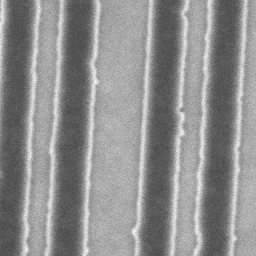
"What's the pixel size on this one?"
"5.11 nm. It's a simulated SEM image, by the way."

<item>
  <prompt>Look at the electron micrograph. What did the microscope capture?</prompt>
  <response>one or a few lines or trenches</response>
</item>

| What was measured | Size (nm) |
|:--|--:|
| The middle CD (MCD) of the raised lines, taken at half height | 196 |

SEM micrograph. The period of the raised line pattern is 374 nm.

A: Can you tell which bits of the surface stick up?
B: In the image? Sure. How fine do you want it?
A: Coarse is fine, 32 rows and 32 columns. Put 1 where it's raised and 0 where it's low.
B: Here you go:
11111000111100000001111000111110
11111000111100000001111000111110
11111001111100000001111000111110
11111001111100000001111000111110
11111001111100000001111000111110
11111001111100000011111000111110
11111001111100000011111000111100
11110001111100000011111000111100
11110001111100000011111000111100
11110001111100000011111000111100
11110001111100000011111000111100
11110001111100000011111001111100
11110001111100000011111001111100
11110001111100000011111001111100
11110001111100000011111001111100
11110001111100000011111001111100
11110001111100000011111001111100
11110001111000000011110001111100
11110011111000000011110001111100
11110011111000000011110001111100
11110011111000000011110001111100
11110011111000000011110001111100
11110011111000000111110001111100
11110011111000000111110001111000
11100011111000000111110001111000
11110011111000000111110001111000
11100011111000000111110001111000
11100011111000000111110011111000
11100011111000000111110011111000
11100011111000000111110001111000
11100011111000000111110001111000
11100011111000000111110011111000